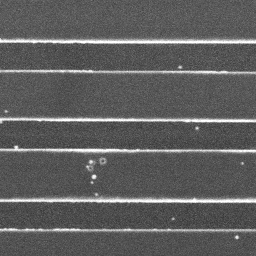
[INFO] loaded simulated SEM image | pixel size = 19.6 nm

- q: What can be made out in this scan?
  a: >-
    lines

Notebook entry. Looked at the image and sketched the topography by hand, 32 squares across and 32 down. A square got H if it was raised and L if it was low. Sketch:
HHHHHHHHHHHHHHHHHHHHHHHHHHHHHHHH
HHHHHHHHHHHHHHHHHHHHHHHHHHHHHHHH
HHHHHHHHHHHHHHHHHHHHHHHHHHHHHHHH
HHHHHHHHHHHHHHHHHHHHHHHHHHHHHHHH
HHHHHHHHHHHHHHHHHHHHHHHHHHHHHHHH
LLLLLLLLLLLLLLLLLLLLLLLLLLLLLLLL
LLLLLLLLLLLLLLLLLLLLLLLLLLLLLLLL
LLLLLLLLLLLLLLLLLLLLLLLLLLLLLLLL
LLLLLLLLLLLLLLLLLLLLLLLLLLLLLLLL
HHHHHHHHHHHHHHHHHHHHHHHHHHHHHHHH
HHHHHHHHHHHHHHHHHHHHHHHHHHHHHHHH
HHHHHHHHHHHHHHHHHHHHHHHHHHHHHHHH
HHHHHHHHHHHHHHHHHHHHHHHHHHHHHHHH
HHHHHHHHHHHHHHHHHHHHHHHHHHHHHHHH
HHHHHHHHHHHHHHHHHHHHHHHHHHHHHHHH
LLLLLLLLLLLLLLLLLLLLLLLLLLLLLLLL
LLLLLLLLLLLLLLLLLLLLLLLLLLLLLLLL
LLLLLLLLLLLLLLLLLLLLLLLLLLLLLLLL
LLLLLLLLLLLLLLLLLLLLLLLLLLLLLLLL
HHHHHHHHHHHHHHHHHHHHHHHHHHHHHHHH
HHHHHHHHHHHHHHHHHHHHHHHHHHHHHHHH
HHHHHHHHHHHHHHHHHHHHHHHHHHHHHHHH
HHHHHHHHHHHHHHHHHHHHHHHHHHHHHHHH
HHHHHHHHHHHHHHHHHHHHHHHHHHHHHHHH
HHHHHHHHHHHHHHHHHHHHHHHHHHHHHHHH
LLLLLLLLLLLLLLLLLLLLLLLLLLLLLLLL
LLLLLLLLLLLLLLLLLLLLLLLLLLLLLLLL
LLLLLLLLLLLLLLLLLLLLLLLLLLLLLLLL
LLLLLLLLLLLLLLLLLLLLLLLLLLLLLLLL
HHHHHHHHHHHHHHHHHHHHHHHHHHHHHHHH
HHHHHHHHHHHHHHHHHHHHHHHHHHHHHHHH
HHHHHHHHHHHHHHHHHHHHHHHHHHHHHHHH